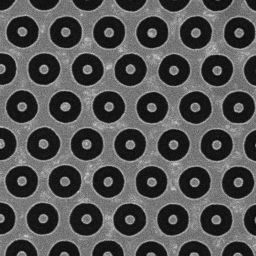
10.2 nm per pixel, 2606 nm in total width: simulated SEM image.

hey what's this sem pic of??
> a regular array of ring-shaped grooves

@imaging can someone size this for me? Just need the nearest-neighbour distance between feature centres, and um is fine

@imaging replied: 0.437